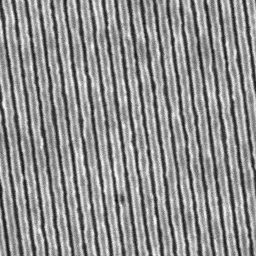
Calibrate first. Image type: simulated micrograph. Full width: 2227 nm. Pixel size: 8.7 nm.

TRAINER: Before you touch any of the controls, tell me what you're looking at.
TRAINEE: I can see parallel lines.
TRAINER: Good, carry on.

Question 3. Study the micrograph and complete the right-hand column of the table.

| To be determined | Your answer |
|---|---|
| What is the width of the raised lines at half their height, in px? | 7.8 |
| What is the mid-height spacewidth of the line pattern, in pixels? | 4.83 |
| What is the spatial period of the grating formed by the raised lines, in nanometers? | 111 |